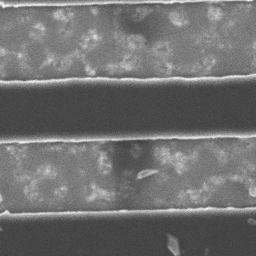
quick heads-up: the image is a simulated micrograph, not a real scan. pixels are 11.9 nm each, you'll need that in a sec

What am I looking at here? one or a few lines or trenches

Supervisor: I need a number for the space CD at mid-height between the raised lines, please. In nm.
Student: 843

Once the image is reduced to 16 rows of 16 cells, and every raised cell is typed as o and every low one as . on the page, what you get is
................
................
................
................
................
oooooooooooooooo
oooooooooooooooo
oooooooooooooooo
oooooooooooooooo
................
................
................
................
oooooooooooooooo
oooooooooooooooo
oooooooooooooooo